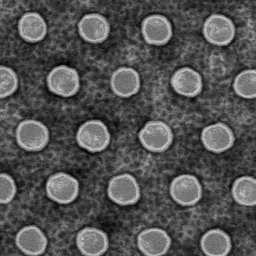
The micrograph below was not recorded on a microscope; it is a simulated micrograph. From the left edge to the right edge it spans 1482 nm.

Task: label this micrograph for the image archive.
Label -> a regular array of raised bodies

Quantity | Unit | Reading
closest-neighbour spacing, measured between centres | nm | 354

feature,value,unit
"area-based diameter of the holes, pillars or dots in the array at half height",171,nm